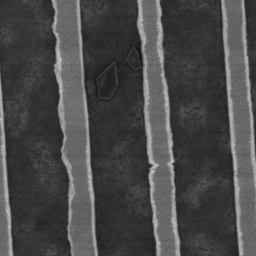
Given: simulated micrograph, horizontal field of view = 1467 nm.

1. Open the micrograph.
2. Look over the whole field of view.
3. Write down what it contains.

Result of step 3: one or a few lines or trenches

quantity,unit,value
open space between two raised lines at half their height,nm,349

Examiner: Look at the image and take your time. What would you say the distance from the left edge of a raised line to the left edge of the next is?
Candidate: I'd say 82.7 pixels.